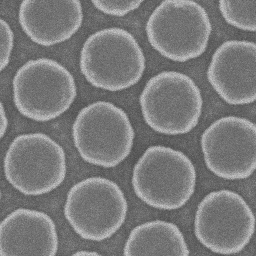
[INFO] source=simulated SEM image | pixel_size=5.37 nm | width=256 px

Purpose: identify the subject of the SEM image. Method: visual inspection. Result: a regular array of raised bodies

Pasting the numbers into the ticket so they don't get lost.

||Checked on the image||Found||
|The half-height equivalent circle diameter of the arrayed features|313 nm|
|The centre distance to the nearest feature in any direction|399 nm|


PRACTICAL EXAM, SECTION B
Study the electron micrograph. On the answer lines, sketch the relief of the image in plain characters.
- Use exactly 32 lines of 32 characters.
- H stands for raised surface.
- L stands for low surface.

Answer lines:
LLLHHHHHHHLLHHHHHLLLHHHHLLLLHHHH
LLLHHHHHHHLLLLHHLLLLHHHHHLLLHHHH
LLLHHHHHHHLLLLLLLLLHHHHHHHLLLHHH
HLLHHHHHHLLLLLLLLLLHHHHHHHLLLLLH
HLLLHHHHHLLLHHHHLLLHHHHHHHLLLLLL
HLLLLLLLLLLHHHHHHLLHHHHHHHLLHHHL
HLLLLLLLLLHHHHHHHLLLHHHHHLLHHHHH
HLLLLLLLLLHHHHHHHHLLLLLLLLLHHHHH
LLLHHHHHLLHHHHHHHHLLLLLLLLHHHHHH
LLHHHHHHHLLHHHHHHLLLHHLLLLHHHHHH
LLHHHHHHHLLLHHHHLLLHHHHHLLLHHHHH
LLHHHHHHHLLLLLLLLLHHHHHHHLLLHHHH
LLHHHHHHHLLLLLLLLLHHHHHHHLLLLHHL
LLLHHHHHLLLHHHLLLLHHHHHHHLLLLLLL
LLLLHHLLLLHHHHHLLLHHHHHHHLLLLLLL
HLLLLLLLLLHHHHHHLLLHHHHHLLLHHHHL
LLLLLLLLLHHHHHHHLLLLLHLLLLHHHHHH
LLHHHHLLLHHHHHHHLLLLLLLLLHHHHHHH
LHHHHHHLLLHHHHHHLLLLLLLLLHHHHHHH
LHHHHHHHLLHHHHHHLLHHHHHLLLHHHHHH
LHHHHHHHLLLLLHLLLHHHHHHHLLHHHHHH
LHHHHHHHLLLLLLLLLHHHHHHHLLLHHHHL
LHHHHHHHLLLLHLLLLHHHHHHHLLLLLLLL
LLHHHHLLLHHHHHHLLHHHHHHHLLLLLLLL
LLLLLLLLLHHHHHHLLLHHHHHHLLHHHLLL
LLLLLLLLHHHHHHHHLLLHHHHLLHHHHHHL
LLHHLLLLHHHHHHHHLLLLLLLLLHHHHHHL
LHHHHHLLLHHHHHHLLLLLLLLLLHHHHHHH
HHHHHHHLLHHHHHLLLHHHHHLLLHHHHHHH
HHHHHHHLLLLHHLLLHHHHHHLLLHHHHHHL
HHHHHHHLLLLLLLLLHHHHHHHLLLHHHHLL
HHHHHHHLLLLLLLLLHHHHHHHLLLLLLLLL